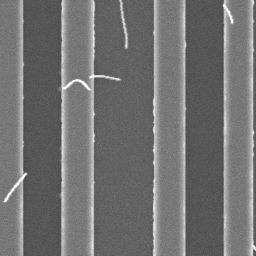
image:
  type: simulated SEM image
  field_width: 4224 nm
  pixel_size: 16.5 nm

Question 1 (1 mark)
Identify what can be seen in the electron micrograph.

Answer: lines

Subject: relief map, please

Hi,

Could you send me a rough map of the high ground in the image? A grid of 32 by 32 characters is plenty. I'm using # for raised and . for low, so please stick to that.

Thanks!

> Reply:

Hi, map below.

###.....####.......####.....####
###.....####.......####.....####
###.....####.......####.....####
###.....####.......####.....####
###.....####.......####.....####
###.....####.......####.....####
###.....####.......####.....####
###.....####.......####.....####
###.....####.......####.....####
###.....####.......####.....####
###.....####.......####.....####
###.....####.......####.....####
###.....####.......####.....####
###.....####.......####.....####
###.....####.......####.....####
###.....####.......####.....####
###.....####.......####.....####
###.....####.......####.....####
###.....####.......####.....####
###.....####.......####.....####
###.....####.......####.....####
###.....####.......####.....####
###.....####.......####.....####
###.....####.......####.....####
###.....####.......####.....####
###.....####.......####.....####
###.....####.......####.....####
###.....####.......####.....####
###.....####.......####.....####
###.....####.......####.....####
###.....####.......####.....####
###.....####.......####.....####